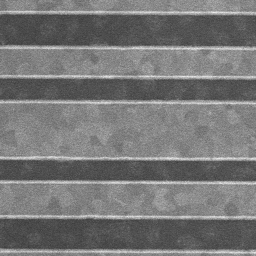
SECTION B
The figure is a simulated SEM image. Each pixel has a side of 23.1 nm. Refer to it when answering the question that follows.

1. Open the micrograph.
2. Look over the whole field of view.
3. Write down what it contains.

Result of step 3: one or a few lines or trenches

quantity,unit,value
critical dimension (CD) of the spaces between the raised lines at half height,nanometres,719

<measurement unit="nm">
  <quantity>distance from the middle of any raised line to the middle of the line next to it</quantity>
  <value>1580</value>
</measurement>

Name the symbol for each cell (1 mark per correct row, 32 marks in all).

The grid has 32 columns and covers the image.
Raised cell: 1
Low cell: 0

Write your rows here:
11111111111111111111111111111111
00000000000000000000000001111111
00000000000000000000000000000000
00000000000000000000000000000000
00000000000000000000000000000000
00000000000000000000000000000000
11111111111111111111111111111111
11111111111111111111111111111111
11111111111111111111111111111111
00000000000000000011111111111111
00000000000000000000000000000000
00000000000000000000000000000000
00000000000000000000000000000000
11111111111111111111111111111111
11111111111111111111111111111111
11111111111111111111111111111111
11111111111111111111111111111111
11111111111111111111111111111111
11111111111111111111111111111111
11111111111111111111111111111111
00000000000000000000000000000000
00000000000000000000000000000000
00000000000000000000000000000000
11111111111111111111111111111111
11111111111111111111111111111111
11111111111111111111111111111111
11111111111111111111111111111111
00000000000000000000000000000000
00000000000000000000000000000000
00000000000000000000000000000000
00000000000000000000000000000000
11110000000000000000000000000000